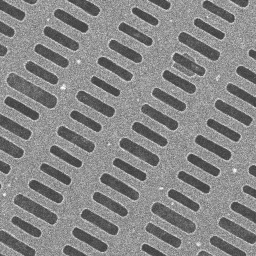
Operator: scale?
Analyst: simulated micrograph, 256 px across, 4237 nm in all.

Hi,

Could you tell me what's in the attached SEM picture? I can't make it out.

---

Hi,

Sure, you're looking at a regular array of holes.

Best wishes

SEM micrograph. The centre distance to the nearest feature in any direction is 332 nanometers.